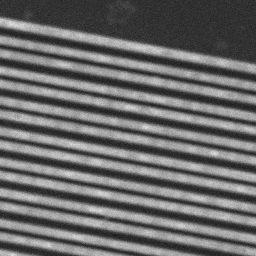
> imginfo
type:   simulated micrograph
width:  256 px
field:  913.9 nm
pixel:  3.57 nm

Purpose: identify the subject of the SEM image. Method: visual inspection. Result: parallel lines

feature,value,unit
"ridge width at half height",8.52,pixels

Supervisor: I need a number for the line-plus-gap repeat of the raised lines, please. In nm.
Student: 53.9